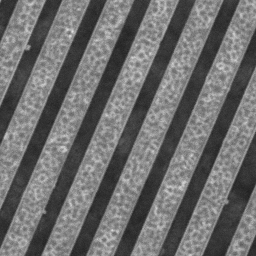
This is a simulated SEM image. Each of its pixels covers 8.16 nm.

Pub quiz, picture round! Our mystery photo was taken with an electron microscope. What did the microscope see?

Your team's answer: parallel lines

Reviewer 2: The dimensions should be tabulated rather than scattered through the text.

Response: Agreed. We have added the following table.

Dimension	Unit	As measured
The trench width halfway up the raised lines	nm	136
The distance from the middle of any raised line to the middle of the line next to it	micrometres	0.333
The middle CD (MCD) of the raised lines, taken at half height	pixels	24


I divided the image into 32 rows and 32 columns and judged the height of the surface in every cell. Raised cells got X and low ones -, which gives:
--XXX---XXX--XXXX--XXX--XXXX--XX
--XXX--XXXX--XXX--XXXX--XXX--XXX
-XXXX--XXX--XXXX--XXX--XXXX--XXX
-XXX--XXXX--XXX---XXX--XXX---XXX
XXXX--XXX---XXX--XXX---XXX--XXX-
XXX---XXX--XXX---XXX--XXX---XXX-
XXX--XXX---XXX--XXX---XXX--XXXX-
XX---XXX--XXXX--XXX--XXXX--XXX--
XX--XXXX--XXX--XXXX--XXX--XXXX--
XX--XXX--XXXX--XXX--XXXX--XXX---
X--XXXX--XXX---XXX--XXX---XXX--X
X--XXX---XXX--XXX---XXX--XXX---X
---XXX--XXX---XXX--XXX---XXX--XX
--XXX---XXX--XXX---XXX--XXXX--XX
--XXX--XXXX--XXX--XXXX--XXX--XXX
-XXXX--XXX--XXXX--XXX--XXXX--XXX
-XXX--XXXX--XXX--XXXX--XXX---XXX
XXXX--XXX--XXXX--XXX---XXX--XXX-
XXX---XXX--XXX---XXX--XXX---XXX-
XXX--XXX---XXX--XXX---XXX--XXXX-
XX---XXX--XXX---XXX--XXXX--XXX--
XX--XXXX--XXX--XXXX--XXX--XXXX--
XX--XXX--XXXX--XXX--XXXX--XXX---
X--XXXX--XXX--XXXX--XXX---XXX---
X--XXX--XXXX--XXX---XXX--XXX---X
---XXX--XXX---XXX--XXX---XXX---X
--XXX---XXX--XXX---XXX--XXX----X
--XXX--XXX---XXX--XXXX--XXX---XX
-XXXX--XXX--XXXX--XXX--XXXX---XX
-XXX--XXXX--XXX--XXXX--XXX---XXX
XXXX--XXX--XXXX--XXX---XXX---XX-
XXX--XXXX--XXX---XXX--XXX---XXX-